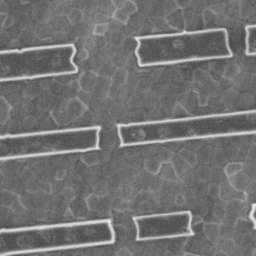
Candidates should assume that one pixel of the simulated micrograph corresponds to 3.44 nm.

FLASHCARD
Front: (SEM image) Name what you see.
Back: one or a few lines or trenches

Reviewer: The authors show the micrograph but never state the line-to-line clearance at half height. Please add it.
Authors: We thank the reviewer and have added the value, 196 nanometers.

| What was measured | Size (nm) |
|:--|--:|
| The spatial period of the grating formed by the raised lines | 297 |